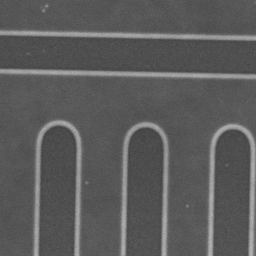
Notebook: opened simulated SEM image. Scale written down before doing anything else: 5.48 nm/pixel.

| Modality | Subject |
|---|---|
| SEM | groups of lines, slits or small figures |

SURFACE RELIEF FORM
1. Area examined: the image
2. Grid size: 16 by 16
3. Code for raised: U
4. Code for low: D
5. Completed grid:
UUUUUUUUUUUUUUUU
UUUUUUUUUUUUUUUU
DDDDDDDDDDDDDDDD
DDDDDDDDDDDDDDDD
UUUDDDDDDDDDDDDD
UUUUUUUUUUUUUUUU
UUUUUUUUUUUUUUUU
UUUUUUUUUUUUUUUU
UUUDDUUUDDUUUUDU
UUDDDUUUDDUUUDDD
UUDDDUUUDDUUUDDD
UUDDDUUUDDUUUDDD
UUDDDUUUDDUUUDDD
UUDDDUUUDDUUUDDD
UUDDDUUUDDUUUDDD
UUDDDUUUDDUUUDDD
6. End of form